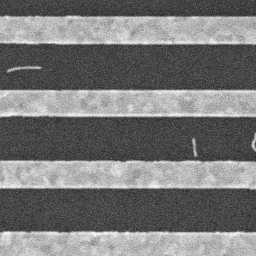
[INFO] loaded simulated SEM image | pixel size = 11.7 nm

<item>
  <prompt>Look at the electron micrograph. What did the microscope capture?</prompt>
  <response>lines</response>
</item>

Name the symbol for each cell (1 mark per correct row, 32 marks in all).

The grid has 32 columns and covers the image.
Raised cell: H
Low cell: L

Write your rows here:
LLLLLLLLLLLLLLLLLLLLLLLLLLLLLLLL
LLLLLLLLLLLLLLLLLLLLLLLLLLLLLLLL
HHHHHHHHHHHHHHHHHHHHHHHHHHHHHHHH
HHHHHHHHHHHHHHHHHHHHHHHHHHHHHHHH
HHHHHHHHHHHHHHHHHHHHHHHHHHHHHHHH
LLLLLLLLLLLLLLLLLLLLLLLLLLLLLLLL
LLLLLLLLLLLLLLLLLLLLLLLLLLLLLLLL
LLLLLLLLLLLLLLLLLLLLLLLLLLLLLLLL
LLLLLLLLLLLLLLLLLLLLLLLLLLLLLLLL
LLLLLLLLLLLLLLLLLLLLLLLLLLLLLLLL
LLLLLLLLLLLLLLLLLLLLLLLLLLLLLLLL
HHHHHHHHHHHHHHHHHHHHHHHHHHHHHHHH
HHHHHHHHHHHHHHHHHHHHHHHHHHHHHHHH
HHHHHHHHHHHHHHHHHHHHHHHHHHHHHHHH
LLLLLLLLLLLLLLLLLLLLLLLLLLLLLLLL
LLLLLLLLLLLLLLLLLLLLLLLLLLLLLLLL
LLLLLLLLLLLLLLLLLLLLLLLLLLLLLLLL
LLLLLLLLLLLLLLLLLLLLLLLLLLLLLLLL
LLLLLLLLLLLLLLLLLLLLLLLLLLLLLLLL
LLLLLLLLLLLLLLLLLLLLLLLLLLLLLLLL
HHHHHHHHHHHHHHHHHHHHHHHHHHHHHHHH
HHHHHHHHHHHHHHHHHHHHHHHHHHHHHHHH
HHHHHHHHHHHHHHHHHHHHHHHHHHHHHHHH
LLLLLLLLLLLLLLLLLLLLLLLLLLLLLLLL
LLLLLLLLLLLLLLLLLLLLLLLLLLLLLLLL
LLLLLLLLLLLLLLLLLLLLLLLLLLLLLLLL
LLLLLLLLLLLLLLLLLLLLLLLLLLLLLLLL
LLLLLLLLLLLLLLLLLLLLLLLLLLLLLLLL
LLLLLLLLLLLLLLLLLLLLLLLLLLLLLLLL
HHHHHHHHHHHHHHHHHHHHHHHHHHHHHHHH
HHHHHHHHHHHHHHHHHHHHHHHHHHHHHHHH
HHHHHHHHHHHHHHHHHHHHHHHHHHHHHHHH